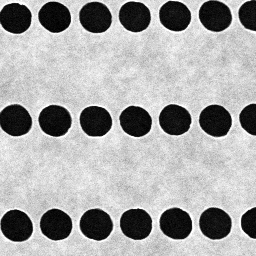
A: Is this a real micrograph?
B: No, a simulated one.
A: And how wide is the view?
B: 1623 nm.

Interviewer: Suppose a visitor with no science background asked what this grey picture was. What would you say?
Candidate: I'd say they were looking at a regular array of holes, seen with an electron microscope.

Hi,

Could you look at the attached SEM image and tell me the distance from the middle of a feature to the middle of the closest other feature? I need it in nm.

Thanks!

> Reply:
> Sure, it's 250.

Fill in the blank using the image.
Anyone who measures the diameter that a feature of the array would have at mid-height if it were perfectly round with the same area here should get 204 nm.